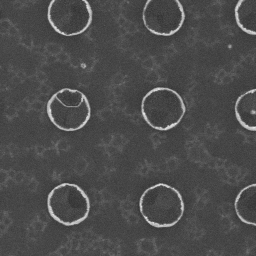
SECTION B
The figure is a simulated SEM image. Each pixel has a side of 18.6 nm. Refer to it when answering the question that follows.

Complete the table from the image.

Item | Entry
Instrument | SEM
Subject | raised bodies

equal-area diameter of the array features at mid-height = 769 nanometers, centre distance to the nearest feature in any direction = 1740 nanometres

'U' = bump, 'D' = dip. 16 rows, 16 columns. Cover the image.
DDDUUUDDDUUDDDDU
DDDUUDDDDUUDDDDU
DDDDDDDDDDDDDDDD
DDDDDDDDDDDDDDDD
DDDDDDDDDDDDDDDD
DDDDDDDDDDDDDDDD
DDDUUDDDDUUDDDDU
DDDUUDDDDUUDDDDU
DDDDDDDDDDDDDDDD
DDDDDDDDDDDDDDDD
DDDDDDDDDDDDDDDD
DDDDDDDDDDDDDDDD
DDDUUDDDDUUDDDDU
DDDUUDDDDUUDDDDU
DDDDDDDDDDDDDDDD
DDDDDDDDDDDDDDDD